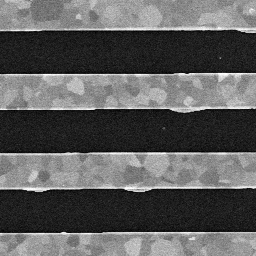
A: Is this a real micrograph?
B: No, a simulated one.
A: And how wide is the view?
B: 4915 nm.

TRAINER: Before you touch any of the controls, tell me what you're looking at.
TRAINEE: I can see lines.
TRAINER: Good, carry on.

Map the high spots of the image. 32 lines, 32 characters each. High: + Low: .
++++++++++++++++++++++++++++++++
++++++++++++++++++++++++++++++++
++++++++++++++++++++++++++++++++
++++++++++++++++++++++++++++++++
................................
................................
................................
................................
................................
++++++++++++++++++++++++++++++++
++++++++++++++++++++++++++++++++
++++++++++++++++++++++++++++++++
++++++++++++++++++++++++++++++++
++++++++++++++++++++++++++++....
................................
................................
................................
................................
................................
++++++++++++++++++++++++++++++++
++++++++++++++++++++++++++++++++
++++++++++++++++++++++++++++++++
++++++++++++++++++++++++++++++++
+++++++.+.......................
................................
................................
................................
................................
................................
++++++++++++++++++++++++++++++++
++++++++++++++++++++++++++++++++
++++++++++++++++++++++++++++++++